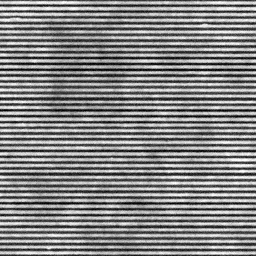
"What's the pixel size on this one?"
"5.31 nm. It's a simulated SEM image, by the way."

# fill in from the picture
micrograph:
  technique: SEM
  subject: parallel lines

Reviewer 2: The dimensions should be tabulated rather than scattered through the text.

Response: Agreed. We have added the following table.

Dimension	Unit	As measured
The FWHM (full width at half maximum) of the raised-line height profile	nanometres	13.3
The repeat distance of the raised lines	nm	30.9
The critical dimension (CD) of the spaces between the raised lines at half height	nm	17.9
